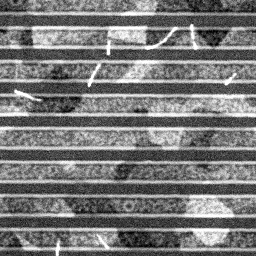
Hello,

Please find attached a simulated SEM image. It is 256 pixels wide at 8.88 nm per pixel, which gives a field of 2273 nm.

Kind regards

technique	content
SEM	parallel lines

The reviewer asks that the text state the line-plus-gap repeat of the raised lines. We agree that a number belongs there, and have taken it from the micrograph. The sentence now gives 298 nm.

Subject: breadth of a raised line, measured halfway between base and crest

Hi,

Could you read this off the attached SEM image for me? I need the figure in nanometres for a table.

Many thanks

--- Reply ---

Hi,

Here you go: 175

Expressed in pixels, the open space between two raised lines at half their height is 13.9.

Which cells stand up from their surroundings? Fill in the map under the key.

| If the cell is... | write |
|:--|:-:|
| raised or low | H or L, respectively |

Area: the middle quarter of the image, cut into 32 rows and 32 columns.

HHHHHHHHHHHHHHHHHHHHHHHHHHHHHHHH
HHHHHHHHHHHHHHHHHHHHHHHHHHHHHHHH
HHHHHHHHHHHHHHHHHHHHHHHHHHHHHHHH
HHHHHHHHHHHHHHHHHHHHHHHHHHHHHHHH
LLLLLLHLLLLLLLLLLLLLLLLLLLLLLLLL
LLLLLLLLLLLLLLLLLLLLLLLLLLLLLLLL
LLLLLLLLLLLLLLLLLLLLLLLLLLLLLLLL
LLLLLLLLLLLLLLLLLLLLLLLLLLLLLLLL
HHHHHHHHHHHHHHHHHHHHHHHHHHHHHHHH
HHHHHHHHHHHHHHHHHHHHHHHHHHHHHHHH
HHHHHHHHHHHHHHHHHHHHHHHHHHHHHHHH
HHHHHHHHHHHHHHHHHHHHHHHHHHHHHHHH
HHHHHHHHHHHHHHHHHHHHHHHHHHHHHHHH
LLLLLLLLLLLLLLLLLLLLLLLLLLLLLLLL
LLLLLLLLLLLLLLLLLLLLLLLLLLLLLLLL
LLLLLLLLLLLLLLLLLLLLLLLLLLLLLLLL
HHHHHHHHHHHHHHHHHHHHHHHHHHHHHHHH
HHHHHHHHHHHHHHHHHHHHHHHHHHHHHHHH
HHHHHHHHHHHHHHHHHHHHHHHHHHHHHHHH
HHHHHHHHHHHHHHHHHHHHHHHHHHHHHHHH
HHHHHHHHHHHHHHHHHHHHHHHHHHHHHHHH
LLLLLLLLLLLLLLLLLLLLLLLLLLLLLLLL
LLLLLLLLLLLLLLLLLLLLLLLLLLLLLLLL
LLLLLLLLLLLLLLLLLLLLLLLLLLLLLLLL
LLLLLLLLLLLLLLLLLLLLHHLLLLLLLLLL
HHHHHHHHHHHHHHHHHHHHHHHHHHHHHHHH
HHHHHHHHHHHHHHHHHHHHHHHHHHHHHHHH
HHHHHHHHHHHHHHHHHHHHHHHHHHHHHHHH
HHHHHHHHHHHHHHHHHHHHHHHHHHHHHHHH
LLLLLLLLLLLLLLLLLLLLLLLLLLLLLLLL
LLLLLLLLLLLLLLLLLLLLLLLLLLLLLLLL
LLLLLLLLLLLLLLLLLLLLLLLLLLLLLLLL